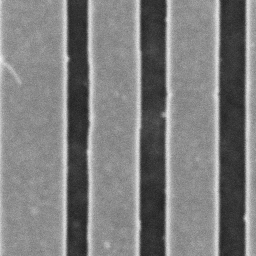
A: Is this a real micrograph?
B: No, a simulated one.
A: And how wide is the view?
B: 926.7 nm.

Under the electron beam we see one or a few lines or trenches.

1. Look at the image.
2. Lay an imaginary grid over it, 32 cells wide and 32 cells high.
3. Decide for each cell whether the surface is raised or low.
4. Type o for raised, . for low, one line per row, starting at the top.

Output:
oooooooo...oooooo....oooooo....o
oooooooo...oooooo....oooooo....o
oooooooo...oooooo....oooooo....o
oooooooo...oooooo....oooooo....o
oooooooo...oooooo....oooooo....o
oooooooo...oooooo....oooooo....o
oooooooo...oooooo....oooooo....o
oooooooo...oooooo....oooooo....o
oooooooo...oooooo....oooooo....o
oooooooo...oooooo....oooooo....o
oooooooo...oooooo....oooooo....o
oooooooo...oooooo....oooooo....o
oooooooo...oooooo....oooooo....o
oooooooo...oooooo....oooooo....o
oooooooo...oooooo....oooooo....o
oooooooo...oooooo....oooooo....o
oooooooo...oooooo....oooooo....o
oooooooo...oooooo....oooooo....o
oooooooo...oooooo....oooooo....o
oooooooo...oooooo....oooooo....o
oooooooo...oooooo....oooooo....o
oooooooo...oooooo....oooooo....o
oooooooo...oooooo....oooooo....o
oooooooo...oooooo....oooooo....o
oooooooo...oooooo....oooooo....o
oooooooo...oooooo....oooooo....o
oooooooo...oooooo....oooooo....o
oooooooo...oooooo....oooooo....o
oooooooo...oooooo....oooooo....o
oooooooo...oooooo....oooooo....o
oooooooo...oooooo....oooooo....o
oooooooo...oooooo....oooooo....o